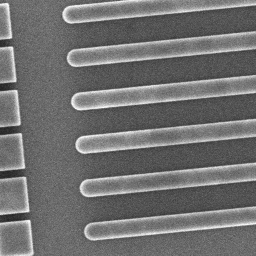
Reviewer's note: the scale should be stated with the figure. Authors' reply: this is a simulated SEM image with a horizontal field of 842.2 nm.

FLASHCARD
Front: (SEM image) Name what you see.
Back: groups of lines, slits or small figures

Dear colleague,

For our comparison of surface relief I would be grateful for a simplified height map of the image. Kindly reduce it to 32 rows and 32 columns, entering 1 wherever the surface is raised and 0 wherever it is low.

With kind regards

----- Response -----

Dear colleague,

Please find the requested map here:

10000000000111111111111111111111
10000000111111111111111000000000
10000000111110000000000000000000
10000000000000000000000000000000
10000000000000000000000000111111
00000000000000001111111111111111
11000000011111111111111111110000
11000000111111111100000000000000
11000000000000000000000000000000
11000000000000000000000000000001
00000000000000000000011111111111
11000000000111111111111111111111
11000000011111111111111000000000
11000000011110000000000000000000
11000000000000000000000000000000
11000000000000000000000000111111
00000000000000001111111111111111
11100000001111111111111111100000
11100000001111111000000000000000
11100000000000000000000000000000
11100000000000000000000000000011
00000000000000000000111111111111
11100000000111111111111111111111
11100000001111111111110000000000
11100000000100000000000000000000
11110000000000000000000000000000
11100000000000000000000001111111
00000000000000011111111111111111
11110000000111111111111111100000
11110000000111111000000000000000
11110000000000000000000000000000
11110000000000000000000000000000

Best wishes